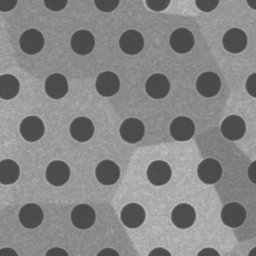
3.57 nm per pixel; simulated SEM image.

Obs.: a regular array of holes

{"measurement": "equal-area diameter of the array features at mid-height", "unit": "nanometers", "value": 91.8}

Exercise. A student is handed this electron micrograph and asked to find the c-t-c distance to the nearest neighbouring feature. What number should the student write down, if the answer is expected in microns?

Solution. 0.177